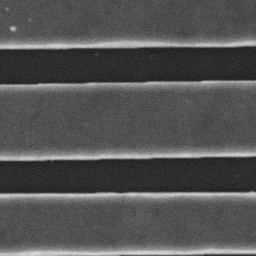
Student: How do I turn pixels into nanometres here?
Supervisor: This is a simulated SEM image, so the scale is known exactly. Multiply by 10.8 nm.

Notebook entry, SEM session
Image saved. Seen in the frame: lines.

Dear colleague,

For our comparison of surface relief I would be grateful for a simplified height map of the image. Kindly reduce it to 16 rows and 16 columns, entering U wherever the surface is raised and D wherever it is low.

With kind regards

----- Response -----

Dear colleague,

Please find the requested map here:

UUUUUUUUUUUUUUUU
UUUUUUUUUUUUUUUU
UUUUUUUUUUUUUUUU
DDDDDDDDDDDDDDDD
DDDDDDDDDDDDDDDD
UUUUUUUUUUUUUUUU
UUUUUUUUUUUUUUUU
UUUUUUUUUUUUUUUU
UUUUUUUUUUUUUUUU
UUUUUUUUUUUUUUUU
DDDDDDDDDDDDDDDD
DDDDDDDDDDDDDDDD
UUUUUUUUUUUUUUUU
UUUUUUUUUUUUUUUU
UUUUUUUUUUUUUUUU
UUUUUUUUUUUUUUUU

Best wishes